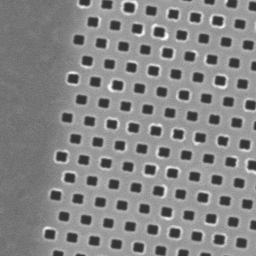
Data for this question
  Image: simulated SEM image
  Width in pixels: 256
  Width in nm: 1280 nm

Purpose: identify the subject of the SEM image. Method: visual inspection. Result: a regular array of holes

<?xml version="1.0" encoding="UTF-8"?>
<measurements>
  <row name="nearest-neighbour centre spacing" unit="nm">112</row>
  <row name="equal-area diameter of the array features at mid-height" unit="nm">53.8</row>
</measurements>